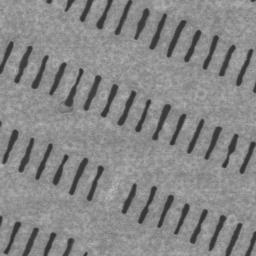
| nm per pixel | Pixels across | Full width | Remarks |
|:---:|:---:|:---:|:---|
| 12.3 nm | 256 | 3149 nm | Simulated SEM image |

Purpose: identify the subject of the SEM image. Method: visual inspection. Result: a regular array of holes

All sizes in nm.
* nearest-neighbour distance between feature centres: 228